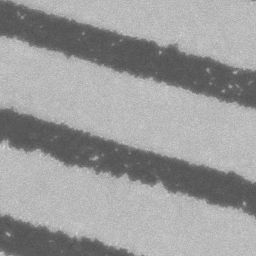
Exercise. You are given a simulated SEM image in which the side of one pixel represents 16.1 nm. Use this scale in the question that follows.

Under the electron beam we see one or a few lines or trenches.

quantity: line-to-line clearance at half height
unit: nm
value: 1070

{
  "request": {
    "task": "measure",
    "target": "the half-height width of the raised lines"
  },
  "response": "0.511 um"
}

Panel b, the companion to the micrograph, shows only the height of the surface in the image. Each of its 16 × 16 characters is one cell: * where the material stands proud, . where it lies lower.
**..............
*****...........
.********.......
....*********...
.......*********
...........*****
...............*
***.............
******..........
.*********......
.....*********..
.........*******
............****
*...............
****............
********........